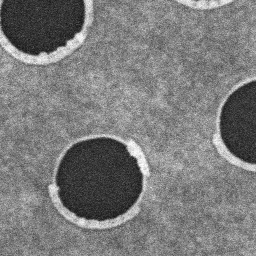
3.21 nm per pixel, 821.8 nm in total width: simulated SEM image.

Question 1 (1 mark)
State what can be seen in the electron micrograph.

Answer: holes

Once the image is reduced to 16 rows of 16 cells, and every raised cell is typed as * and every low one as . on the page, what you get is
.....***********
.....***********
....************
****************
****************
***************.
**************..
**************..
**************..
****....******..
****.....*******
****.....*******
****.....*******
*****...********
****************
****************